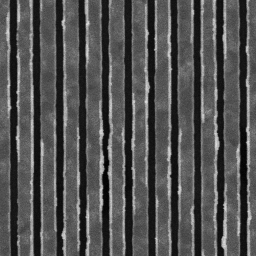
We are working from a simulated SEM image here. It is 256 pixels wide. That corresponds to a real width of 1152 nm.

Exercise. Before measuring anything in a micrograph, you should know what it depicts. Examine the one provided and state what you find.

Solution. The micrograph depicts parallel lines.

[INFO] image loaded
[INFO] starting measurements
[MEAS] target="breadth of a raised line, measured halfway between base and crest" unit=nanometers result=68.1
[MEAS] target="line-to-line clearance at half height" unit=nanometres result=32.1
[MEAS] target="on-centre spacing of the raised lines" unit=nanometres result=103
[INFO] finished